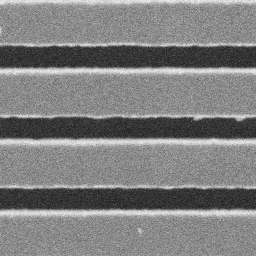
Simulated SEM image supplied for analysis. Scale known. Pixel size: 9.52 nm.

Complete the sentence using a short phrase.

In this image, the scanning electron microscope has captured lines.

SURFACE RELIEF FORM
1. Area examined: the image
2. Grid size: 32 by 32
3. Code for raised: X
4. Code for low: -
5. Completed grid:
XXXXXXXXXXXXXXXXXXXXXXXXXXXXXXXX
XXXXXXXXXXXXXXXXXXXXXXXXXXXXXXXX
XXXXXXXXXXXXXXXXXXXXXXXXXXXXXXXX
XXXXXXXXXXXXXXXXXXXXXXXXXXXXXXXX
XXXXXXXXXXXXXXXXXXXXXXXXXXXXXXXX
XXXXXXXXXXXXXXXXXXXXXXXXXXXXXXXX
--------------------------------
--------------------------------
--------------------------------
XXXXXXXXXXXXXXXXXXXXXXXXXXXXXXXX
XXXXXXXXXXXXXXXXXXXXXXXXXXXXXXXX
XXXXXXXXXXXXXXXXXXXXXXXXXXXXXXXX
XXXXXXXXXXXXXXXXXXXXXXXXXXXXXXXX
XXXXXXXXXXXXXXXXXXXXXXXXXXXXXXXX
XXXXXXX-X--XXX-XXXXX-XXXXXXXXXXX
--------------------------------
--------------------------------
XXXXXXXXXXXXXXXXXXXXXXXXXXXXXXXX
XXXXXXXXXXXXXXXXXXXXXXXXXXXXXXXX
XXXXXXXXXXXXXXXXXXXXXXXXXXXXXXXX
XXXXXXXXXXXXXXXXXXXXXXXXXXXXXXXX
XXXXXXXXXXXXXXXXXXXXXXXXXXXXXXXX
XXXXXXXXXXXXXXXXXXXXXXXXXXXXXXXX
---XX-X-------------XX---X--XXXX
--------------------------------
--------------------------------
XXXXXXXXXXXXXXXXXXXXXXXXXXXXXXXX
XXXXXXXXXXXXXXXXXXXXXXXXXXXXXXXX
XXXXXXXXXXXXXXXXXXXXXXXXXXXXXXXX
XXXXXXXXXXXXXXXXXXXXXXXXXXXXXXXX
XXXXXXXXXXXXXXXXXXXXXXXXXXXXXXXX
XXXXXXXXXXXXXXXXXXXXXXXXXXXXXXXX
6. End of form